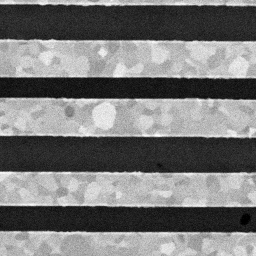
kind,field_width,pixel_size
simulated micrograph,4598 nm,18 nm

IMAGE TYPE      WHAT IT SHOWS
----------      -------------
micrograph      lines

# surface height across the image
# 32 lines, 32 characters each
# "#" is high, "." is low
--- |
.....##..#######################
................................
................................
................................
................................
################################
################################
################################
################################
################################
................................
................................
############################....
################################
################################
################################
################################
................................
................................
................................
................................
................................
################################
################################
################################
################################
................................
................................
................................
################################
################################
################################